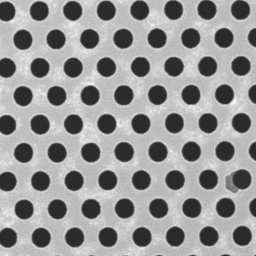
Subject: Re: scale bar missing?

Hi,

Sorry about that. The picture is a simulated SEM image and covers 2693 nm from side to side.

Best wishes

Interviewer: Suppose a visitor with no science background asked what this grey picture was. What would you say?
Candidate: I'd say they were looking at a regular array of holes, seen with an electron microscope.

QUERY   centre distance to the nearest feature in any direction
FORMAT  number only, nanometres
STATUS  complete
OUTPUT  344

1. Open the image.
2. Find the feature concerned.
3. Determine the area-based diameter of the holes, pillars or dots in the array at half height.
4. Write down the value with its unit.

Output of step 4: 0.209 µm